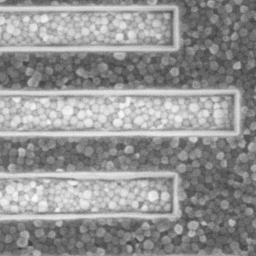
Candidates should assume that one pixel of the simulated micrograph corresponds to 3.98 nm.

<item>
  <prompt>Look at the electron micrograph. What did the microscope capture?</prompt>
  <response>one or a few lines or trenches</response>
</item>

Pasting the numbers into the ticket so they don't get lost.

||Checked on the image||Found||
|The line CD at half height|172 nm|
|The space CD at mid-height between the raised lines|159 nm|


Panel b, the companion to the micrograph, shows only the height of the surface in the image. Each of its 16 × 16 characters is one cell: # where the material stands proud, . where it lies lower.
#######....#####
...........#####
...........#####
################
################
################
...............#
...............#
################
################
################
...........#####
...........#####
.....###########
################
################